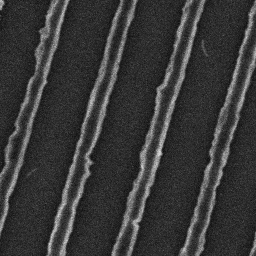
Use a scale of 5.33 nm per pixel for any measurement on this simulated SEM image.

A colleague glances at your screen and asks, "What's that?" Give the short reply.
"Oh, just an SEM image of one or a few lines or trenches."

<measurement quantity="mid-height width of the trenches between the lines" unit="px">51.3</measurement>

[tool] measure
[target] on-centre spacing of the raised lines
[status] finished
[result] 348 nanometres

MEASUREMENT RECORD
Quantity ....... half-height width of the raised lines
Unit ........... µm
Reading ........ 0.0762